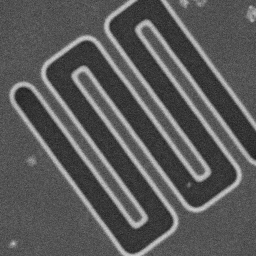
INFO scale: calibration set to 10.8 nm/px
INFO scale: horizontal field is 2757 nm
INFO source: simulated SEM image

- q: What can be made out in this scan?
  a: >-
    groups of lines, slits or small figures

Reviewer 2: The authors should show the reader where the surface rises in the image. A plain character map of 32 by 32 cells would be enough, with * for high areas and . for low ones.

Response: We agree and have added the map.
****************.....***********
***************......***********
**************........**********
**************...**....*********
**************....**....********
*********...***...***...********
********.....**....**....*******
*******.......**....**....******
******........***...***...******
******...**....***...***...*****
******....**....**....**....****
**..***...***....**....**....***
**...***...***...***...***....**
**....**....**....***...***...**
***....**....**....**....**....*
****...***...***...***....**....
****....**....***...***...***...
*****....**....**....**....***..
******....**....**....**....**..
*******...***...***...***...***.
*******....***...***...***...***
********....**....**....**....**
*********...***...***.........**
**********...***...***.......***
**********....**....**.....*****
***********....**....**...******
************...***...***********
************....**....**********
*************.........**********
**************......************
***************....*************
***************...**************